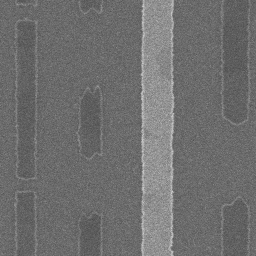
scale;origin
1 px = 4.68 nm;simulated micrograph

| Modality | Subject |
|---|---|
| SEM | one or a few lines or trenches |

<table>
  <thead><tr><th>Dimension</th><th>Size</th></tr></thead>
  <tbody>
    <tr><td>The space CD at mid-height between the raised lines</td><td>213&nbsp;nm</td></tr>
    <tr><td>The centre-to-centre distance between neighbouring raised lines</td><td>324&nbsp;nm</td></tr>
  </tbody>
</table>